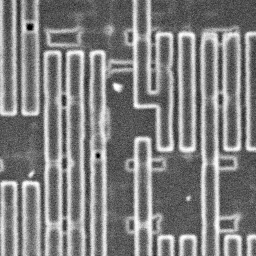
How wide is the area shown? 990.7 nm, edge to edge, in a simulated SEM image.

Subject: wiring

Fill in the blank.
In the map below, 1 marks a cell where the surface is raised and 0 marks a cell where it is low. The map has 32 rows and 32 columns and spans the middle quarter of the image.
01111001110000000011100111100111
01111001110000000011100111000111
01111001110000000011100111100111
01111001110000000011100111100111
01111001110000000011100111100111
01111001110001000011100111100111
01111001110001000011110111100111
01111001110000000011111111100111
01111001110000000011111111100111
01111001110000000011111111100111
01111001110000000011111111100111
01111001110000000000000111100111
01111001110000000000000111100111
01111001100000000000000111100111
01111001100000000000000111100111
01111001100000000000000111100111
01111001100000000000000111100111
01111001110000000000000111100111
01111001110000000000000111100111
01111001110000000011100111100111
01111001110000000011100111100111
01111001110000000011100011100111
01111001110000000011100000000000
01111001110000000011100000000000
01111001110000000011100000000000
01111001110000000011100000000000
01111001110000000011100000000000
01111001110000000011100000000000
01111001110000000011110000000000
01111001110000000011110000000000
01111001110000000011110000000000
01111001110000000011110000000000